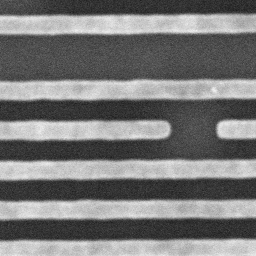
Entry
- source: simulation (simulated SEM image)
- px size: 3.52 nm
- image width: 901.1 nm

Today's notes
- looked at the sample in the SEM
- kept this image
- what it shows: groups of lines, slits or small figures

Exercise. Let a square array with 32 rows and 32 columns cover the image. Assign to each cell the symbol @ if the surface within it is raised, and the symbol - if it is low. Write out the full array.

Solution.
--------------------------------
--------------------------------
@@@@@@@@@@@@@@@@@@@@@@@@@@@@@@@@
@@@@@@@@@@@@@@@@@@@@@@@@@@@@@@@@
--------------------------------
--------------------------------
--------------------------------
--------------------------------
--------------------------------
--------------------------------
@@@@@@@@@@@@@@@@@@@@@@@@@@@@@@@@
@@@@@@@@@@@@@@@@@@@@@@@@@@@@@@@@
--------------------------------
--------------------------------
--------------------------------
@@@@@@@@@@@@@@@@@@@@@------@@@@@
@@@@@@@@@@@@@@@@@@@@@------@@@@@
--------------------------------
--------------------------------
--------------------------------
@@@@@@@@@@@@@@@@@@@@@@@@@@@@@@@@
@@@@@@@@@@@@@@@@@@@@@@@@@@@@@@@@
--------------------------------
--------------------------------
--------------------------------
@@@@@@@@@@@@@@@@@@@@@@@@@@@@@@@@
@@@@@@@@@@@@@@@@@@@@@@@@@@@@@@@@
--------------------------------
--------------------------------
--------------------------------
@@@@@@@@@@@@@@@@@@@@@@@@@@@@@@@@
@@@@@@@@@@@@@@@@@@@@@@@@@@@@@@@@